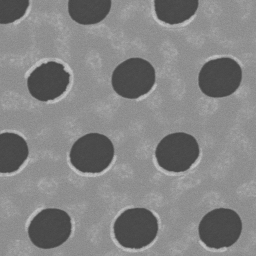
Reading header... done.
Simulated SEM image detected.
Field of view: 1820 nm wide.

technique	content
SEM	a regular array of holes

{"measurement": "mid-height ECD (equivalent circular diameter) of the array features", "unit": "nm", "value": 299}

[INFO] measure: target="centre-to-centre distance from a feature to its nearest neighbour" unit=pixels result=84.8